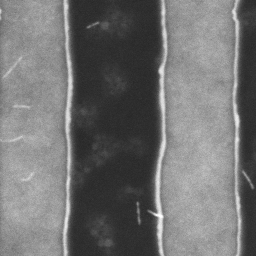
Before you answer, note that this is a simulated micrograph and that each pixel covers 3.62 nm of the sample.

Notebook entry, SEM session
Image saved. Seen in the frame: one or a few lines or trenches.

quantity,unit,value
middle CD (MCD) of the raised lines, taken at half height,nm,350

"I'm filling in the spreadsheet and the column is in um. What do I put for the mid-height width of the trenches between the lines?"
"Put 0.26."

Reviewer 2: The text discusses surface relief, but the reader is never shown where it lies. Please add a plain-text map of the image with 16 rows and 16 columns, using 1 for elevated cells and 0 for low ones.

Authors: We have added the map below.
0000111111000001
0000111111000001
0000111111000001
0000111111000001
0000111111000001
0000111111000001
0000111111000001
0000111111000001
0000111111000001
0000111111000001
0000111111000001
0000111111000001
0000111111000001
0000111111000001
0000111111000001
0000111111000001